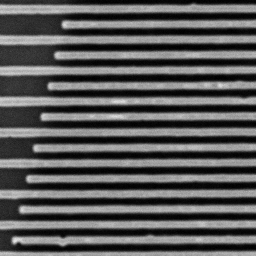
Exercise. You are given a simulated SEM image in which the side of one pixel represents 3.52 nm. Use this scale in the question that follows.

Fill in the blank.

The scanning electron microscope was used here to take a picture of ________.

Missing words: parallel lines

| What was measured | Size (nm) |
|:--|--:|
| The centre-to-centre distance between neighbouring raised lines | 54.1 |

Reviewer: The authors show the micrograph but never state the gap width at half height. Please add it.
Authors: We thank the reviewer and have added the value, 27.7 nm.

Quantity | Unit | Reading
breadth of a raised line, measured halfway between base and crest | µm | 0.0277